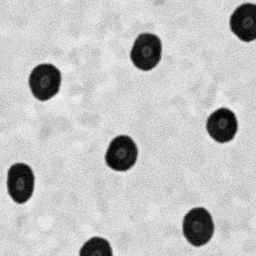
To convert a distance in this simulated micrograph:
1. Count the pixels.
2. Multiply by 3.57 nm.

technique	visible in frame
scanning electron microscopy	ring-shaped grooves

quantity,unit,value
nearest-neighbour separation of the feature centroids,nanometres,371